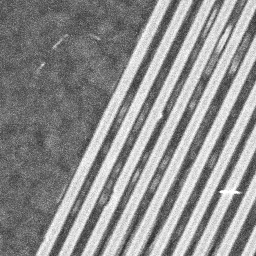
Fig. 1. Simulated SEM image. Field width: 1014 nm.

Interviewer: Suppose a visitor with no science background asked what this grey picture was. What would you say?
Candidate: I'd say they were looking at parallel lines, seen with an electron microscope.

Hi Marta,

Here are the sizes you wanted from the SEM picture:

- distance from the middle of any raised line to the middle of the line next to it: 80.5 nanometres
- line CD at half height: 34.9 nm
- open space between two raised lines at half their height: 11.7 pixels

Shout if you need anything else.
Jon